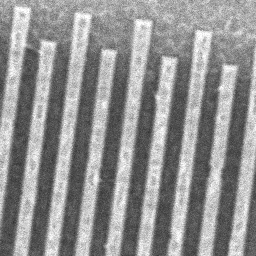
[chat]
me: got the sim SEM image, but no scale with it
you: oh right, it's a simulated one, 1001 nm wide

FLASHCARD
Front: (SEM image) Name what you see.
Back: parallel lines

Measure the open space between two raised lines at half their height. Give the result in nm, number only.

65.5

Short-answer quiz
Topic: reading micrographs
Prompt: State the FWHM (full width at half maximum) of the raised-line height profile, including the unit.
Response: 52.9 nm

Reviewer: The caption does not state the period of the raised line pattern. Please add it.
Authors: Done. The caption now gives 0.119 microns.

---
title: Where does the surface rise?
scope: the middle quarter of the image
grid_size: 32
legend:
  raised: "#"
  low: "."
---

.####....###.....###....####....
.####....###.....###....####....
.####....###.....###....####....
.###.....###....####....###.....
.###.....###....####....###.....
.###.....###....###.....###....#
.###....####....###.....###....#
####....###.....###....####....#
####....###.....###....####....#
####....###.....###....####....#
###.....###....####....####....#
###.....###....####....###.....#
###.....###....###.....###....##
###....####....###.....###....##
###....####....###.....###....##
###....###.....###....####....##
###....###.....###....####....##
###....###.....###....####....##
##.....###....####....###.....##
##.....###....####....###.....##
##.....###....###.....###....###
##....####....###.....###....###
##....###.....###....####....###
##....###.....###....####....###
##....###.....###....####....###
#.....###....####....####....###
#.....###....####....###.....###
#.....###....###.....###....####
#....####....###.....###....####
#....####....###.....###....####
#....###.....###....####....####
#....###.....###....####....###.